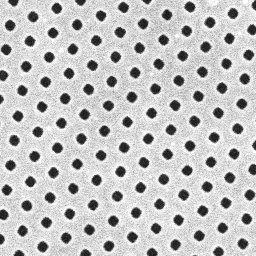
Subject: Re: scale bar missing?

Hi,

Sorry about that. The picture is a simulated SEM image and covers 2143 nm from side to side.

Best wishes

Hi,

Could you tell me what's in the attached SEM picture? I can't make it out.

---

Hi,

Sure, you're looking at a regular array of holes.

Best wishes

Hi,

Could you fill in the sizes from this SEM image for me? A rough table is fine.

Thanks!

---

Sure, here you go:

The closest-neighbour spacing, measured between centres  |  206 nanometres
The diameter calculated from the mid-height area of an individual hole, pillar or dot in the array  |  0.0945 um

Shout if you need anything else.